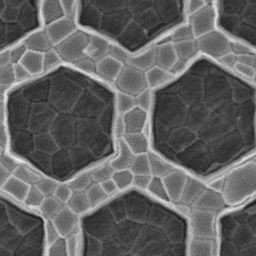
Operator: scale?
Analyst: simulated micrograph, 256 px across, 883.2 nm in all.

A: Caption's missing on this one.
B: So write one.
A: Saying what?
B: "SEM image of holes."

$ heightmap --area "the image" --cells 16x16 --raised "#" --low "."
..###......###..
..###......###..
.######...#####.
################
###..#######..##
#......###......
.......###......
.......##.......
#......###......
#......###......
##...######...##
################
.######...######
..###......###..
...##.......##..
...##.......##..